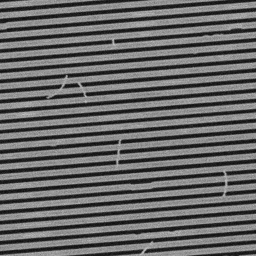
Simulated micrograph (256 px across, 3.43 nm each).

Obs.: parallel lines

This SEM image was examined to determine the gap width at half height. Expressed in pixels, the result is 3.85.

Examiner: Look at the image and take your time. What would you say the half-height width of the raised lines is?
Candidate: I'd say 19.6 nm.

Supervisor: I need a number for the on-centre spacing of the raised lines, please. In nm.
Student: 34.5